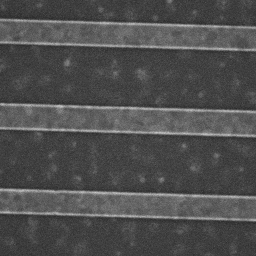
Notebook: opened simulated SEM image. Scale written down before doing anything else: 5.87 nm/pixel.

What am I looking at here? one or a few lines or trenches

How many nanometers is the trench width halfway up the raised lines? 358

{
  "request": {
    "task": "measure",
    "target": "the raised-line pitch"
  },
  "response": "498 nm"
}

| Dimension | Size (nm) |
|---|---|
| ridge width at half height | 138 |